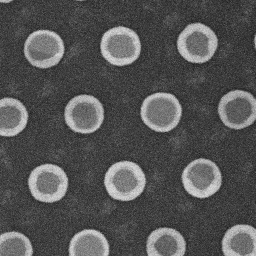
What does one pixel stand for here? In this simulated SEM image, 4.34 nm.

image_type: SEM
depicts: a regular array of raised bodies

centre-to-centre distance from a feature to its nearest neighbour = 76.8 px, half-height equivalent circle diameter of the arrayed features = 155 nanometers